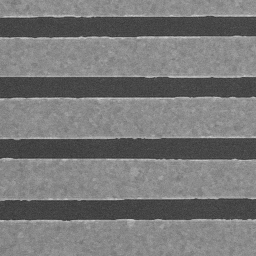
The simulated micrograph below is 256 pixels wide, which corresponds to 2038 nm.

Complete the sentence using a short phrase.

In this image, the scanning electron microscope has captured lines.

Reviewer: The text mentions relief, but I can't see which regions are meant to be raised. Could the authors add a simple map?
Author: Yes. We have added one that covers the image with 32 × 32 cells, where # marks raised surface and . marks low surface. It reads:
################################
################################
................................
................................
................................
################################
################################
################################
################################
################################
................................
................................
################################
################################
################################
################################
################################
................................
................................
................................
################################
################################
################################
################################
################################
................................
................................
...............##..#.....#.#.#..
################################
################################
################################
################################